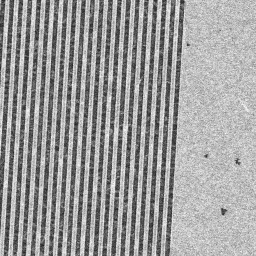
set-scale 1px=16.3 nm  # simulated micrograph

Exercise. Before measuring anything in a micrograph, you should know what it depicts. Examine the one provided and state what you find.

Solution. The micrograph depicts parallel lines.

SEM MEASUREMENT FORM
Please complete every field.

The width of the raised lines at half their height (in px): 3.37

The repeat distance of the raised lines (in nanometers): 146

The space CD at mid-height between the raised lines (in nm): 91.8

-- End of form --